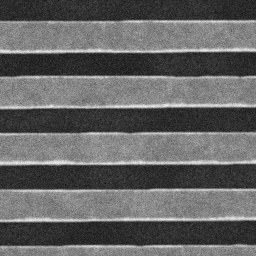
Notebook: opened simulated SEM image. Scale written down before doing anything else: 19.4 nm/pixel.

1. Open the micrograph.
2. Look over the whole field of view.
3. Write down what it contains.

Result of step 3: lines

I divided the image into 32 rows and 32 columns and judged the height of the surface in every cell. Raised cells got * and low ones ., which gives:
................................
................................
................................
********************************
********************************
********************************
**********************..........
................................
................................
................................
********************************
********************************
********************************
***.............................
................................
................................
................................
********************************
********************************
********************************
**************************.**...
................................
................................
................................
********************************
********************************
********************************
*************************.......
................................
................................
................................
********************************